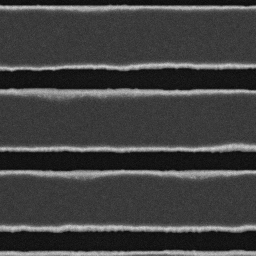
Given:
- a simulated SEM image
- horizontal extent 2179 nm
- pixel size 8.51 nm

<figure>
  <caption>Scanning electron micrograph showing lines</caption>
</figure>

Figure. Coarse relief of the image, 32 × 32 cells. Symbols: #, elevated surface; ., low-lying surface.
................................
################################
################################
################################
################################
################################
################################
################################
########...#######..............
................................
................................
################################
################################
################################
################################
################################
################################
################################
################################
................................
................................
################################
################################
################################
################################
################################
################################
################################
################################
................................
................................
##...####..##..###########.#####